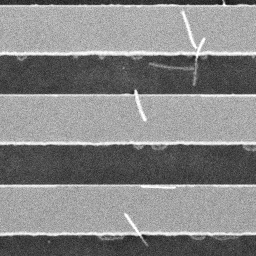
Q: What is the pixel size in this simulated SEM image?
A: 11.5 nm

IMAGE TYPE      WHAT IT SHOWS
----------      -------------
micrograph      lines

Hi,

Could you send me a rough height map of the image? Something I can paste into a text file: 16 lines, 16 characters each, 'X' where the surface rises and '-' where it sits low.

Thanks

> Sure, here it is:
XXXXXXXXXXXXXXXX
XXXXXXXXXXXXXXXX
XXXXXXXXXXXXXXXX
----------------
----------------
----------------
XXXXXXXXXXXXXXXX
XXXXXXXXXXXXXXXX
XXXXXXXXXXXXXXXX
----------------
----------------
----------------
XXXXXXXXXXXXXXXX
XXXXXXXXXXXXXXXX
XXXXXXXXXXXXXXXX
----------------